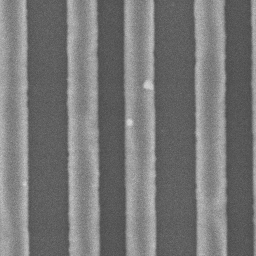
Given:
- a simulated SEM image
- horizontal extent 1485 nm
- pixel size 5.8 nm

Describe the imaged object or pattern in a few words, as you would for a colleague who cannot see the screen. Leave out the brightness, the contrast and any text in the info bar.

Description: lines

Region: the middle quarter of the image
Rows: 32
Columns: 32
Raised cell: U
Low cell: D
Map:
DUUUUUUUDDDDDDDUUUUUUUDDDDDDDDDD
DUUUUUUUDDDDDDDUUUUUUUDDDDDDDDDD
DUUUUUUUDDDDDDDUUUUUUUDDDDDDDDDD
DUUUUUUUDDDDDDDUUUUUUUDDDDDDDDDD
DUUUUUUUDDDDDDDUUUUUUUDDDDDDDDDD
DUUUUUUUDDDDDDDUUUUUUUDDDDDDDDDD
DUUUUUUUDDDDDDDUUUUUUUDDDDDDDDDD
DUUUUUUUDDDDDDDUUUUUUUDDDDDDDDDD
DUUUUUUUDDDDDDDUUUUUUUDDDDDDDDDD
DUUUUUUUDDDDDDDUUUUUUUDDDDDDDDDD
DUUUUUUUDDDDDDDUUUUUUUDDDDDDDDDD
DUUUUUUUDDDDDDDDUUUUUUUDDDDDDDDD
DUUUUUUUDDDDDDDDUUUUUUUDDDDDDDDD
DUUUUUUUDDDDDDDDUUUUUUUDDDDDDDDD
DUUUUUUUDDDDDDDDUUUUUUUDDDDDDDDD
DUUUUUUUDDDDDDDUUUUUUUUDDDDDDDDD
DUUUUUUUDDDDDDDDUUUUUUUDDDDDDDDD
DUUUUUUUDDDDDDDDUUUUUUUDDDDDDDDD
DUUUUUUUDDDDDDDDUUUUUUUDDDDDDDDD
DUUUUUUUDDDDDDDDUUUUUUUDDDDDDDDD
DUUUUUUUDDDDDDDDUUUUUUUDDDDDDDDD
DUUUUUUUUDDDDDDDUUUUUUUDDDDDDDDD
DUUUUUUUDDDDDDDDUUUUUUUDDDDDDDDD
DUUUUUUUUDDDDDDDUUUUUUUDDDDDDDDD
DUUUUUUUUDDDDDDDUUUUUUUDDDDDDDDD
DUUUUUUUUDDDDDDDUUUUUUUDDDDDDDDD
DUUUUUUUUDDDDDDDUUUUUUUDDDDDDDDD
DUUUUUUUUDDDDDDDUUUUUUUDDDDDDDDD
DUUUUUUUUDDDDDDDUUUUUUUDDDDDDDDD
DUUUUUUUUDDDDDDDUUUUUUUDDDDDDDDD
DUUUUUUUUDDDDDDDUUUUUUUDDDDDDDDD
DDUUUUUUDDDDDDDDUUUUUUUDDDDDDDDD